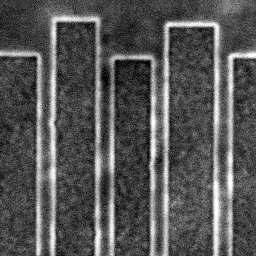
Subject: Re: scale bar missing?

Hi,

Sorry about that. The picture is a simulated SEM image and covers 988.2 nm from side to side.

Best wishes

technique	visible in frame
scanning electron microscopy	parallel lines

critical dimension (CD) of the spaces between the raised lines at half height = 159 nm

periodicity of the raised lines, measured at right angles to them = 59 px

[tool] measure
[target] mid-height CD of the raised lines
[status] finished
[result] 0.067 micrometres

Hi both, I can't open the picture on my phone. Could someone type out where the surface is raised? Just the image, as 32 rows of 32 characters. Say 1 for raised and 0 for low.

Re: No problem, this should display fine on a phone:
11111111111111111111111111111111
11111111111111111111111111111111
11111110000111111111111111111111
11111110000011111111100000011111
11111110000011111111100000011111
11111110000011111111100000011111
11111110000011111111100000011111
00000110000011100001100000011000
00000110000011000001100000011000
00000110000011000001100000011000
00000110000011000001100000011000
00000110000011000001100000011000
00000110000011000001100000011000
00000110000011000001100000011000
00000110000011000001100000011000
00000110000011000001100000011000
00000110000011000001100000011000
00000110000011000001100000011000
00000110000011000001100000011000
00000110000011000001100000011000
00000110000011000001100000011000
00000110000011000001100000011000
00000110000011000001100000011000
00000110000011000001100000011000
00000110000011000001100000011000
00000110000011000001100000011000
00000110000011000001100000011000
00000110000011000001100000011000
00000110000011000001100000011000
00000110000011000001100000011000
00000110000011000001100000011000
00000110000011000001100000011000